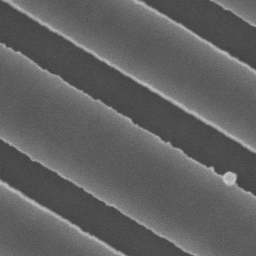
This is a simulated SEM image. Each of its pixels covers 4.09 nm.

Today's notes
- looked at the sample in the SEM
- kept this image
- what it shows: lines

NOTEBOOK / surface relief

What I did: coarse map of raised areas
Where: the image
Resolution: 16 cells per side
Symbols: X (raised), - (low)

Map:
-XXXXXXXX-----XX
---XXXXXXXX-----
----XXXXXXXXX---
XX----XXXXXXXX--
XXX-----XXXXXXXX
XXXXX----XXXXXXX
XXXXXXX----XXXXX
XXXXXXXX-----XXX
XXXXXXXXXX----XX
-XXXXXXXXXX-----
---XXXXXXXXXX---
-----XXXXXXXXXX-
XX----XXXXXXXXXX
XXXX----XXXXXXXX
XXXXX-----XXXXXX
XXXXXXX----XXXXX